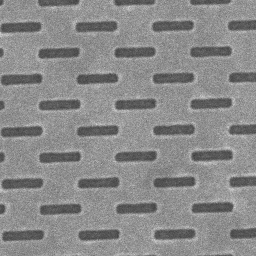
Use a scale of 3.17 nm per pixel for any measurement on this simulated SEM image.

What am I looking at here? a regular array of holes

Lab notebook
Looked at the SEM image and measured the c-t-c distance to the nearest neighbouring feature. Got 145 nm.